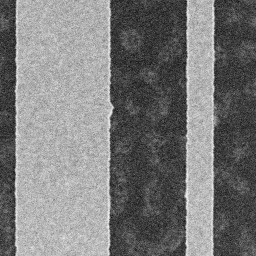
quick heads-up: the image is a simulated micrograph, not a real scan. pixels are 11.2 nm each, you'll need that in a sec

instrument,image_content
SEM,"one or a few lines or trenches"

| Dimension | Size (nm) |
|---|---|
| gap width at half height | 874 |